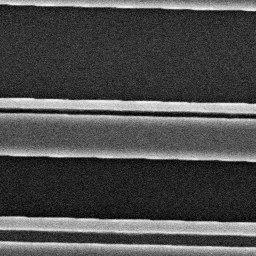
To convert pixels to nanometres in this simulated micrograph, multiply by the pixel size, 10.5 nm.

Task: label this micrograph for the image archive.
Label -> lines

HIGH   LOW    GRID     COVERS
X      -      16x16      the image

-----------XXXXX
----------------
----------------
----------------
----------------
----------------
XXXXXXXXXXXXXX--
XXXXXXXXXXXXXXXX
XXXXXXXXXXXXXXXX
XXXXXXXXXXXXXXXX
----------------
----------------
----------------
----------------
XXXXXXXXXXXXXXXX
XXXXXXXXXXXXXXXX